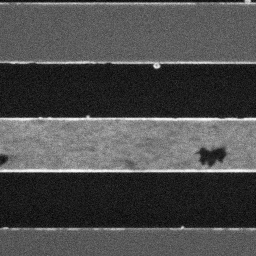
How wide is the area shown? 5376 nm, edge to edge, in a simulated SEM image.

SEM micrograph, lines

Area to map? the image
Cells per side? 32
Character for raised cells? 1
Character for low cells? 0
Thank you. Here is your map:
11111111111111111111111111111111
11111111111111111111111111111111
11111111111111111111111111111111
11111111111111111111111111111111
11111111111111111111111111111111
11111111111111111111111111111111
11111111111111111111111111111111
11111111111111111111111111111111
00000000000000000000000000000000
00000000000000000000000000000000
00000000000000000000000000000000
00000000000000000000000000000000
00000000000000000000000000000000
00000000000000000000000000000000
00000000000000000000000000000000
11111111111111111111111111111111
11111111111111111111111111111111
11111111111111111111111111111111
11111111111111111111111111111111
11111111111111111111111111111111
11111111111111111111111111111111
00000000000000000000000000000000
00000000000000000000000000000000
00000000000000000000000000000000
00000000000000000000000000000000
00000000000000000000000000000000
00000000000000000000000000000000
00000000000000000000000000000000
00000000000000000000000000000000
11111111111111111111111111111111
11111111111111111111111111111111
11111111111111111111111111111111